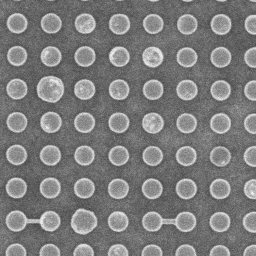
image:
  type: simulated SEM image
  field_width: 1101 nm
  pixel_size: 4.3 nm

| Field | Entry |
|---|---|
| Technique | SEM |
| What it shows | a regular array of raised bodies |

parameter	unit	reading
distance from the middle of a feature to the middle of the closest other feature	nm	141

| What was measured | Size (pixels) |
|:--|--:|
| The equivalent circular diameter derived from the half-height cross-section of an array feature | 20.2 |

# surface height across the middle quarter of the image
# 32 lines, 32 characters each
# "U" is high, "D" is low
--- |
DDDDDDDDDDDDDDDDDDDDDUUDDDDDDDUU
DDDDDDDDDDDDDDDDDDDDDDDDDDDDDDDD
DDDDDDDDDDDDDDDDDDDDDDDDDDDDDDDD
DDDDDDDDDDDDDDDDDDDDDDDDDDDDDDDD
DDDDUUUDDDDDUUUDDDDDDUUUDDDDDUUU
DDDUUUUUDDDUUUUUDDDDUUUUUDDDUUUU
DDDUUUUUDDDUUUUUDDDDUUUUUDDDUUUU
DDDUUUUUDDDUUUUUDDDDUUUUDDDDUUUU
DDDDUUDDDDDDDUUDDDDDDUUUDDDDDUUU
DDDDDDDDDDDDDDDDDDDDDDDDDDDDDDDD
DDDDDDDDDDDDDDDDDDDDDDDDDDDDDDDD
DDDDDDDDDDDDDDDDDDDDDDDDDDDDDDDD
DDDDUUDDDDDDDUUDDDDDDUUDDDDDDDDD
DDDUUUUDDDDUUUUUDDDDUUUUDDDDDUUU
DDDUUUUUDDDUUUUUDDDDUUUUUDDDUUUU
DDDUUUUUDDDUUUUUDDDDUUUUUDDDUUUU
DDDUUUUDDDDDUUUDDDDDUUUUDDDDDUUU
DDDDDDDDDDDDDDDDDDDDDDDDDDDDDDDD
DDDDDDDDDDDDDDDDDDDDDDDDDDDDDDDD
DDDDDDDDDDDDDDDDDDDDDDDDDDDDDDDD
DDDDDDDDDDDDDUDDDDDDDDDDDDDDDDDD
DDDUUUUDDDDDUUUUDDDDUUUUDDDDDUUU
DDDUUUUDDDDUUUUUDDDDUUUUUDDDUUUU
DDDUUUUDDDDUUUUUDDDDUUUUUDDDUUUU
DDDUUUUDDDDDUUUUDDDDUUUUDDDDDUUU
DDDDDDDDDDDDDDDDDDDDDDDDDDDDDDDD
DDDDDDDDDDDDDDDDDDDDDDDDDDDDDDDD
DDDDDDDDDDDDDDDDDDDDDDDDDDDDDDDD
DDDDDDDDDDDDDDDDDDDDDDDDDDDDDDDD
DDDUUUUDDDDDUUUDDDDDUUUUDDDDDUUU
DDDUUUUDDDDUUUUUDDDDUUUUDDDDUUUU
DDDUUUUDDDDUUUUUDDDDUUUUDDDDUUUU